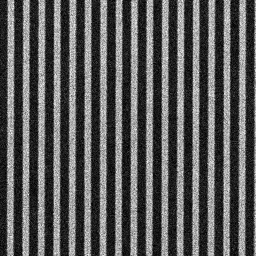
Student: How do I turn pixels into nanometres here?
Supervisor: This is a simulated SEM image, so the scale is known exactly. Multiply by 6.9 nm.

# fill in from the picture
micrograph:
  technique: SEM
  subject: parallel lines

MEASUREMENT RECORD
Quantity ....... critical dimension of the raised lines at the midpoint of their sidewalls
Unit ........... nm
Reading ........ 44.8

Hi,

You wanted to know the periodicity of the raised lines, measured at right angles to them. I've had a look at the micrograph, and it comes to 107 nm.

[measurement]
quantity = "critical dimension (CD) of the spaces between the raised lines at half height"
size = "64.7 nanometers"